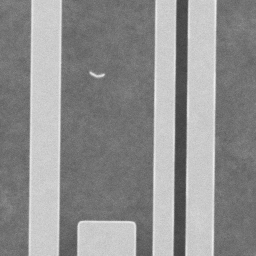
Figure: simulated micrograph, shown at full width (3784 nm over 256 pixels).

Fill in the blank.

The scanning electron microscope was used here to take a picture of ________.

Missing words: groups of lines, slits or small figures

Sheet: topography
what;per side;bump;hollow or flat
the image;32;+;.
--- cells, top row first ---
....++++...........+++..+++.....
....++++...........+++..+++.....
....++++...........+++..+++.....
....++++...........+++..+++.....
....++++...........+++..+++.....
....++++...........+++..+++.....
....++++...........+++..+++.....
....++++...........+++..+++.....
....++++...........+++..+++.....
....++++...........+++..+++.....
....++++...........+++.++++.....
....++++...........+++.++++.....
....+++............+++.++++.....
....+++............+++.++++.....
....+++............+++.++++.....
....+++............+++.++++.....
....+++............+++.++++.....
....+++............+++.++++.....
....+++............+++.++++.....
....+++............+++.++++.....
....+++............+++.++++.....
....+++............+++.++++.....
....+++............+++.++++.....
....+++............+++.++++.....
....+++............+++.++++.....
....+++............+++.++++.....
....+++............+++.++++.....
....+++............+++.++++.....
....+++...+++++++..+++.++++.....
....+++...+++++++..+++.++++.....
....+++...+++++++..+++.++++.....
....+++...+++++++..+++.++++.....